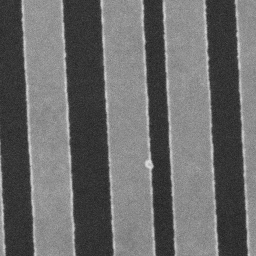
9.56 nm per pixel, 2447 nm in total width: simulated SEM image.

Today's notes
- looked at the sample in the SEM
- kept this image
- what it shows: lines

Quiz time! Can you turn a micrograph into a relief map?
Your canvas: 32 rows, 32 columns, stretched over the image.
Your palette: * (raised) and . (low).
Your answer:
...*****.....*****..******...***
...*****.....*****..******....**
...*****.....*****...*****....**
...*****.....*****...*****....**
...*****.....*****...*****....**
...*****.....*****...*****....**
...*****.....*****...*****....**
...*****.....*****...*****....**
...*****.....*****...*****....**
...*****.....*****...*****....**
...*****.....*****...*****....**
...*****.....*****...*****....**
...*****.....*****...*****....**
...*****.....*****...*****....**
...*****.....*****...*****....**
....*****....*****...*****....**
....*****.....*****..*****....**
....*****.....*****..*****....**
....*****.....*****..******...**
....*****.....*****..******...**
....*****.....*****..******....*
....*****.....*****..******....*
....*****.....*****..******....*
....*****.....*****...*****....*
....*****.....*****...*****....*
....*****.....*****...*****....*
....*****.....*****...*****....*
....*****.....*****...*****....*
....*****.....*****...*****....*
....*****.....*****...*****....*
....*****.....*****...*****....*
*...*****.....*****...*****....*